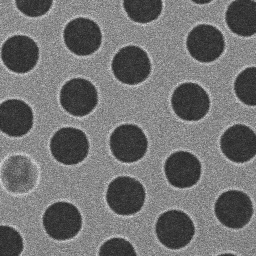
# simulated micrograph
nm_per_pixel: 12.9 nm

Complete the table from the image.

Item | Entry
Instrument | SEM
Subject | a regular array of holes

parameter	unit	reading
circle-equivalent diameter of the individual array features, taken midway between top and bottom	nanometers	507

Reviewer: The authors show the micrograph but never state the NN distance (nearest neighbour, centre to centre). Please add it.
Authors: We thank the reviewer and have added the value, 749 nm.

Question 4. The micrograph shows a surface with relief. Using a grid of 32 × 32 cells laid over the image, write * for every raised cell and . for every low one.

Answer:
**.....********.....*****.***...
***...**********....********....
*********..*****...*********....
********....************...**...
**.*****.....**********.....**.*
.....***.....**********.....****
.....****...***...******....****
.....*********.....******..*****
*...**********.....************.
**************.....***********..
********....****.******..****...
********....**********....***...
*..****.....*********.....****..
....****....**********....******
....*****..***********....******
....****************************
....***...****....**********....
******.....***....*********.....
******.....***....**********....
*******....***....***...****....
********..***********....*******
*********************....*******
**************...****....*******
*************.....****.*********
*************.....*********....*
*******..****.....*********.....
******....****...****..****.....
*****.....**********....***....*
..***.....*********.....*****.**
...***...***********....********
...**********...****...*********
...*********.....***************